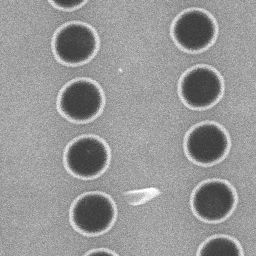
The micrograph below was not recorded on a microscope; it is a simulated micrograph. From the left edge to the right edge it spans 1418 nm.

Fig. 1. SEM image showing a regular array of raised bodies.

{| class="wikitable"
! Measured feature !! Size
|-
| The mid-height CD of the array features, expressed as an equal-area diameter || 245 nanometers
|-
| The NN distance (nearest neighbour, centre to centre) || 0.315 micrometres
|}